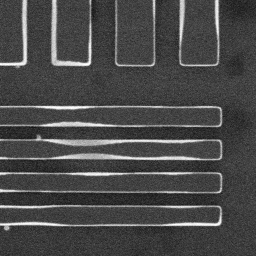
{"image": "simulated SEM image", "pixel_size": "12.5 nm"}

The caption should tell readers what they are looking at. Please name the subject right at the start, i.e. groups of lines, slits or small figures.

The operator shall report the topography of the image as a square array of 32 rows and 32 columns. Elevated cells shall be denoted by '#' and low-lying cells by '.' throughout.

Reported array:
###....####....####....####.....
###....####....####....####.....
###....####....####....####.....
###....####....####....####.....
###....####....####....####.....
###....####....####....####.....
###....####...#####....####.....
###....####...#####....####.....
................................
................................
................................
................................
................................
###########################.....
############################....
############################....
................................
######..........................
############################....
##########...###############....
................................
................................
############################....
############################....
................................
................................
############################....
############################....
................................
................................
................................
................................